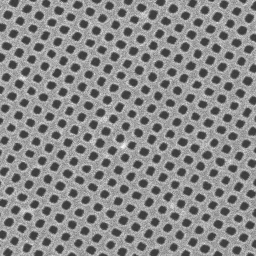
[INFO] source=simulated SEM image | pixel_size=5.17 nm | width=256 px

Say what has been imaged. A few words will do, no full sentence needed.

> a regular array of holes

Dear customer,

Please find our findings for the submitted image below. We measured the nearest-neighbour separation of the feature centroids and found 70.9 nm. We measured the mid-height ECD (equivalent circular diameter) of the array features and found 0.0463 micrometres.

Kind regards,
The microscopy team